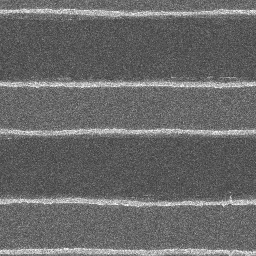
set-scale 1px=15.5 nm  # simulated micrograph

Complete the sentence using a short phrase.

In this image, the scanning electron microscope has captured one or a few lines or trenches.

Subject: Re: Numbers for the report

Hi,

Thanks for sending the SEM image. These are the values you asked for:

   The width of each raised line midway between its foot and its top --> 758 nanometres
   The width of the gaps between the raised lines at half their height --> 70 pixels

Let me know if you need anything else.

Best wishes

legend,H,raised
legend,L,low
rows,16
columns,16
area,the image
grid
HHHHHHHHHHHHHHHH
LLLLLLLLLLLLLLLL
LLLLLLLLLLLLLLLL
LLLLLLLLLLLLLLLL
LLLLLLLLLLLLLLLL
HHHHHHHHHHHHHHHH
HHHHHHHHHHHHHHHH
HHHHHHHHHHHHHHHH
LLLLLLLLLLLLLLLL
LLLLLLLLLLLLLLLL
LLLLLLLLLLLLLLLL
LLLLLLLLLLLLLLLL
LLLLLLLLLLLLLLLL
HHHHHHHHHHHHHHHH
HHHHHHHHHHHHHHHH
HHHHHHHHHHHHHHHH